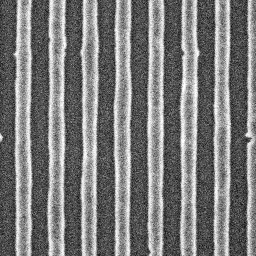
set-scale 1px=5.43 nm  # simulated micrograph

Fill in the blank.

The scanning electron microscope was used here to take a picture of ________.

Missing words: parallel lines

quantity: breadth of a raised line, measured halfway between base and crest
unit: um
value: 0.0773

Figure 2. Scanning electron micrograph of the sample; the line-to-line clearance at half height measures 102 nm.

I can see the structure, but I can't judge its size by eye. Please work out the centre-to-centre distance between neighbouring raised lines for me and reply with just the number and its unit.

180 nanometers